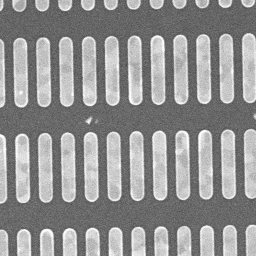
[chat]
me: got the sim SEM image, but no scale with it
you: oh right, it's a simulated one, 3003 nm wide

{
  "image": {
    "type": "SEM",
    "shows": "groups of lines, slits or small figures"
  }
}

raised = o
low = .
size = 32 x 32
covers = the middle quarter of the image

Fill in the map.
oo...ooo...oo...ooo...ooo...ooo.
oo...ooo...oo...ooo...ooo...ooo.
oo...ooo...oo...ooo...ooo...ooo.
oo...ooo...oo...ooo...ooo...ooo.
oo...ooo...oo....oo...ooo...ooo.
oo...ooo...oo....oo...ooo...ooo.
oo...ooo...oo....oo...ooo...ooo.
oo...ooo...oo....oo...ooo...ooo.
oo...ooo...oo....oo...ooo...ooo.
oo...ooo...oo....oo...ooo...oo..
................................
................................
................................
................................
................................
................................
................................
......o....oo....oo....oo...ooo.
oo...ooo...ooo...ooo..ooo...ooo.
oo...ooo...ooo...ooo..ooo...ooo.
oo...ooo...ooo...ooo..ooo...ooo.
oo...ooo...ooo...ooo..ooo...ooo.
oo...ooo...ooo...ooo..ooo...ooo.
oo...ooo...ooo...ooo..ooo...ooo.
oo...ooo...ooo...ooo..oooo..ooo.
ooo..ooo...ooo...ooo..oooo..ooo.
ooo..ooo...ooo...ooo..oooo..ooo.
ooo..ooo...ooo...ooo..oooo..ooo.
ooo..ooo...ooo...ooo...ooo..ooo.
ooo..ooo...ooo...ooo...ooo..ooo.
ooo..ooo...ooo...ooo...ooo..ooo.
ooo..ooo...ooo...ooo...ooo..ooo.